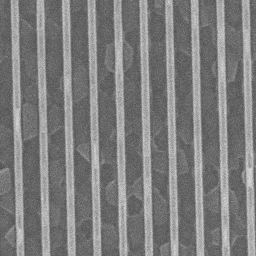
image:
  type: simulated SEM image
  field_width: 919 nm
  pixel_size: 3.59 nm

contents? parallel lines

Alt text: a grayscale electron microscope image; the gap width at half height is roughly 67.3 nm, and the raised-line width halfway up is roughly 24.2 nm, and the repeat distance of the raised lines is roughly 92.3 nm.